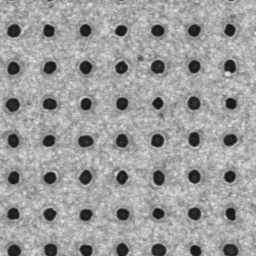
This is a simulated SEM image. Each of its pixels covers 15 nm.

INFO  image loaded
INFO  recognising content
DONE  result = a regular array of holes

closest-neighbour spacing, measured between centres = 0.535 microns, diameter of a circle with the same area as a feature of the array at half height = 196 nanometers